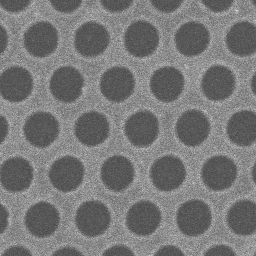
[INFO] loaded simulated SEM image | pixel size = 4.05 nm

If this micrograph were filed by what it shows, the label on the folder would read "a regular array of holes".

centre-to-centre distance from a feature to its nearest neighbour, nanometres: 204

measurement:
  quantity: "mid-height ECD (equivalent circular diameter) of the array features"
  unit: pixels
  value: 36.3